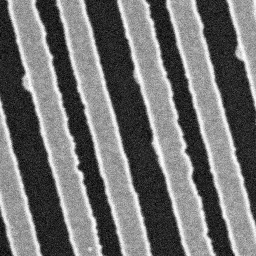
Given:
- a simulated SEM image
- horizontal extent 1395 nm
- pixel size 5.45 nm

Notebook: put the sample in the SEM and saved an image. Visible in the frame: lines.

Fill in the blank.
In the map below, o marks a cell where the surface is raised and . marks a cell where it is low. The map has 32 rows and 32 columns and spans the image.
.ooo...oooo....ooo...ooo.....ooo
.oooo...ooo....oooo..oooo....ooo
..ooo...ooo....oooo..oooo....ooo
..oooo..ooo.....ooo...ooo....ooo
..oooo..oooo....ooo...ooo.....oo
..oooo..oooo....oooo..oooo....oo
...ooo...ooo....oooo...ooo....oo
...oooo..ooo.....ooo...ooo....oo
...oooo..oooo....ooo...oooo....o
...oooo..oooo....oooo..oooo....o
...oooo...ooo.....ooo...ooo....o
....ooo...ooo.....oooo..ooo.....
....oooo..oooo....oooo..oooo....
.....ooo...ooo....oooo..oooo....
o....ooo...ooo.....ooo...ooo....
o....ooo...oooo....ooo...ooo....
o....oooo..oooo....oooo..oooo...
o.....ooo...ooo....oooo..oooo...
oo....ooo...ooo.....ooo...ooo...
oo....oooo..oooo....ooo...ooo...
oo....oooo..oooo....oooo..oooo..
oo.....ooo...ooo....oooo...ooo..
ooo....ooo...ooo.....ooo...ooo..
ooo....oooo..oooo....ooo...oooo.
ooo....oooo..oooo....oooo..oooo.
oooo....ooo...ooo.....ooo...ooo.
oooo....ooo...oooo....ooo...ooo.
.ooo....oooo..oooo....oooo..oooo
.ooo....oooo...ooo....oooo...ooo
.oooo....ooo...ooo.....ooo...ooo
.oooo....ooo...oooo....ooo...ooo
..ooo....oooo..oooo....oooo..ooo